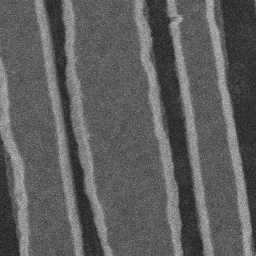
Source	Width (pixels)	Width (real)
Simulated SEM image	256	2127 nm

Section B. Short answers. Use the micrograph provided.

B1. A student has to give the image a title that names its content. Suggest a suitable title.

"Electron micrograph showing one or a few lines or trenches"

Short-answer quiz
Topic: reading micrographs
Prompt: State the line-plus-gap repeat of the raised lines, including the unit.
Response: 726 nm